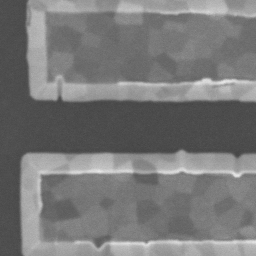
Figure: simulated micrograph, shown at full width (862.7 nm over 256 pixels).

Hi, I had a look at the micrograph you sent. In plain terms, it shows one or a few lines or trenches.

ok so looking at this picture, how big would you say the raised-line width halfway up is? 304 nanometers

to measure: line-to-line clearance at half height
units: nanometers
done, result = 232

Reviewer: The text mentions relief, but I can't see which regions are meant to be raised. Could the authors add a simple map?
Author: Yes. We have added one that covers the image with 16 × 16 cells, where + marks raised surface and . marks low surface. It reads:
..++++++++++++++
..++++++++++++++
..++++++++++++++
..++++++++++++++
..++++++++++++++
..++++++++++++++
................
................
................
................
..++++++++++++++
..++++++++++++++
..++++++++++++++
..++++++++++++++
..++++++++++++++
..++++++++++++++